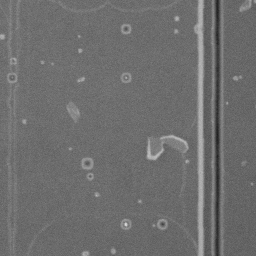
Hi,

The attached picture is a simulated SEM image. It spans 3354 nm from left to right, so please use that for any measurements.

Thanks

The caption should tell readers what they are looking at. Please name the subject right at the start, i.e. wiring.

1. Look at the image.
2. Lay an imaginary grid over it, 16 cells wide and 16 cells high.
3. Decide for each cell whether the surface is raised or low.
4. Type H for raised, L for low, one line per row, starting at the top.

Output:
HHHHHHHHHHHHHLLL
HHHHHHHHHHHHLLLL
HHHHHHHHHHHHHLLL
HHHHHHHHHHHHHLLL
HHHHHHHHHHHHHLLL
HHHHHHHHHHHHHLLL
HHHHHHHHHHHHHLLL
HHHHHHHHHHHHHLLL
HHHHHHHHHHHHHLLL
HHHHHHHHHHHHHLLL
HHHHHHHHHHHHHLLL
HHHHHHHHHHHHHLLL
HHHHHHHHHHHHHLLL
HHHHHHHHHHHHHLLL
HHHHHHHHHHHHHLLL
HHHHHHHHHHHHHLLL